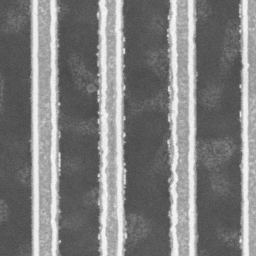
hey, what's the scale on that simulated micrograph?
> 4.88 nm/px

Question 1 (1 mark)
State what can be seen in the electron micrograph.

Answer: one or a few lines or trenches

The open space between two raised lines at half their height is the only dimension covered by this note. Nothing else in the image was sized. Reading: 0.263 micrometres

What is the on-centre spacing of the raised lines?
338 nanometres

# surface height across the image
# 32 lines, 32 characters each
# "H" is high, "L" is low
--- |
LLLLHHHLLLLLLHHLLLLLLLHHLLLLLLLH
LLLLHHHLLLLLLHHLLLLLLLHHLLLLLLLH
LLLLHHHLLLLLLHHLLLLLLLHHLLLLLLLH
LLLLHHHLLLLLLHHLLLLLLLHHLLLLLLLH
LLLLHHHLLLLLLHHLLLLLLLHHLLLLLLLH
LLLLHHHLLLLLLHHLLLLLLLHHLLLLLLLH
LLLLHHHLLLLLLHHLLLLLLLHHLLLLLLLH
LLLLHHHLLLLLLHHLLLLLLLHHLLLLLLLH
LLLLHHHLLLLLLHHLLLLLLLHHLLLLLLLH
LLLLHHHLLLLLLHHLLLLLLLHHLLLLLLLH
LLLLHHHLLLLLLHHLLLLLLLHHLLLLLLLH
LLLLHHHLLLLLLHHLLLLLLLHHLLLLLLLH
LLLLHHHLLLLLLHHLLLLLLLHHLLLLLLLH
LLLLHHHLLLLLLHHLLLLLLLHHLLLLLLLH
LLLLHHHLLLLLLHHLLLLLLLHHLLLLLLLH
LLLLLHHLLLLLLHHLLLLLLLHHLLLLLLLH
LLLLLHHLLLLLLHHLLLLLLLHHLLLLLLLH
LLLLLHHLLLLLLHHLLLLLLLHHLLLLLLLH
LLLLLHHLLLLLLHHLLLLLLLHHLLLLLLLH
LLLLLHHLLLLLLHHLLLLLLLHHLLLLLLLH
LLLLLHHLLLLLLHHLLLLLLLHHLLLLLLLH
LLLLLHHLLLLLLHHLLLLLLLHHLLLLLLLH
LLLLLHHLLLLLLHHLLLLLLLHHLLLLLLLH
LLLLLHHLLLLLLHHLLLLLLLHHLLLLLLLH
LLLLLHHLLLLLLHHLLLLLLLHHLLLLLLLH
LLLLLHHLLLLLLHHLLLLLLLHHLLLLLLLH
LLLLLHHLLLLLLHHLLLLLLLHHLLLLLLLH
LLLLLHHLLLLLLHHLLLLLLLHHLLLLLLLH
LLLLLHHLLLLLLHHLLLLLLLHHLLLLLLLH
LLLLLHHLLLLLLHHLLLLLLLHHLLLLLLLH
LLLLLHHLLLLLLHHLLLLLLLHHLLLLLLLH
LLLLLHHLLLLLLHHLLLLLLLHHLLLLLLLH